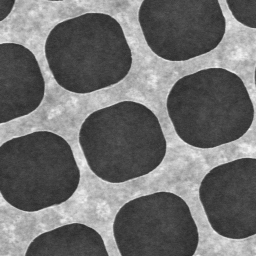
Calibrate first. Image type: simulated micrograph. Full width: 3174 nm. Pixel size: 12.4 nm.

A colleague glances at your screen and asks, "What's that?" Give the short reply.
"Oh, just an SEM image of holes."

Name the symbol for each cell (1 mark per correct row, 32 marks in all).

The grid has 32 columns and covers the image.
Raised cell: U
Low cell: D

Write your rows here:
DDUUUUUUUUUUUUUUUUDDDDDDDDDUDDDD
DUUUUUUUUUUUUUUUUDDDDDDDDDDDUDDD
UUUUUUUUDDDDDDUUUDDDDDDDDDDDUUDD
UUUUUUUDDDDDDDDUUUDDDDDDDDDDUUUU
UUUUUUDDDDDDDDDDUUDDDDDDDDDDUUUU
DDUUUUDDDDDDDDDDUUDDDDDDDDDUUUUU
DDDDUUDDDDDDDDDDUUUDDDDDDDUUUUUU
DDDDDUDDDDDDDDDDUUUUUDDUUUUUUUUU
DDDDDUDDDDDDDDDDUUUUUUUUUUDUUUUU
DDDDDUUDDDDDDDDDUUUUUUUDDDDDDDUU
DDDDDDUDDDDDDDUUUUUUUUDDDDDDDDUU
DDDDDDUUUDDDUUUUUUUUUDDDDDDDDDDU
DDDDDUUUUUUUUUUUUUUUUDDDDDDDDDDU
DDDDDUUUUUUUUDDDDDUUUDDDDDDDDDDD
DDDUUUUUUUUDDDDDDDDUUDDDDDDDDDDD
UUUUUUUUUUDDDDDDDDDDUUDDDDDDDDDU
UUUUDDUUUUDDDDDDDDDDUUDDDDDDDDDU
UDDDDDDDUUDDDDDDDDDDDUUDDDDDDUUU
DDDDDDDDDUDDDDDDDDDDDUUUUDUUUUUU
DDDDDDDDDUUDDDDDDDDDDUUUUUUUUUUU
DDDDDDDDDDUDDDDDDDDDUUUUUUUUDDDD
DDDDDDDDDDUUDDDDDDDUUUUUUUDDDDDD
DDDDDDDDDDUUUDDDUUUUUUUUUDDDDDDD
DDDDDDDDDDUUUUUUUUUUUUUUUDDDDDDD
DDDDDDDDDUUUUUUUUUDDDDUUUDDDDDDD
UDDDDDDDUUUUUUUUDDDDDDDUUDDDDDDD
UUUUUUUUUUUUUUUDDDDDDDDDUUDDDDDD
UUUUUUUUUUUUUUDDDDDDDDDDUUDDDDDD
UUUUUUUDDDDUUUDDDDDDDDDDDUUDDDDD
UUUUUDDDDDDDDUDDDDDDDDDDDUUUDDDU
UUUUDDDDDDDDDUUDDDDDDDDDDUUUUUUU
UUUDDDDDDDDDDUUDDDDDDDDDUUUUUUUU